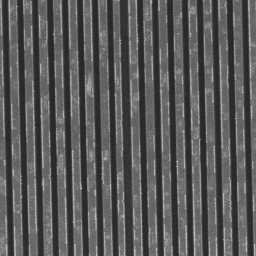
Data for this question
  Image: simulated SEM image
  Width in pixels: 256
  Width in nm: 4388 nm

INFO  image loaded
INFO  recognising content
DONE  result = parallel lines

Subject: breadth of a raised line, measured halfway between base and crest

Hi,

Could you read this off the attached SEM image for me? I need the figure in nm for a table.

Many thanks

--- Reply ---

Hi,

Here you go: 156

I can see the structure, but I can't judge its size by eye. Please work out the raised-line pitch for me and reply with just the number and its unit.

257 nanometers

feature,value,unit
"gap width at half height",94.2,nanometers